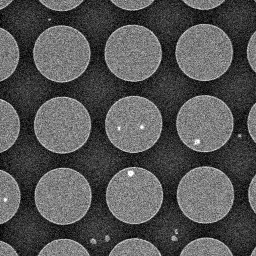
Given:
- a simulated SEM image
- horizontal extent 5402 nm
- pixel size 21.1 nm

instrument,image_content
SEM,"an array of small figures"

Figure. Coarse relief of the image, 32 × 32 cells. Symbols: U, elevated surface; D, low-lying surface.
UDDDDUUUUUDDDDUUUUUDDDDUUUUUDDDD
DDDDDDDDDDDDDDDDDDDDDDDDDDDDDDDD
DDDDDDDDDDDDDDDDDDDDDDDDDDDDDDDD
DDDDDDUUUDDDDDDUUUDDDDDDUUUDDDDD
UDDDDUUUUUDDDDUUUUUDDDDUUUUUDDDD
UUDDUUUUUUUDDUUUUUUUDDUUUUUUUDDU
UUDDUUUUUUUDDUUUUUUUDDUUUUUUUDDU
UUDDUUUUUUUDDUUUUUUUDDUUUUUUUDDU
UUDDDUUUUUUDDDUUUUUUDDDUUUUUDDDD
UDDDDDUUUUDDDDDUUUUDDDDDUUUDDDDD
DDDDDDDDDDDDDDDDDDDDDDDDDDDDDDDD
DDDDDDDDDDDDDDDDDDDDDDDDDDDDDDDD
DDDDDDUUUDDDDDDUUUUDDDDDUUUUDDDD
UUDDDUUUUUUDDDUUUUUUDDDUUUUUUDDD
UUDDDUUUUUUDDUUUUUUUDDUUUUUUUDDU
UUDDUUUUUUUDDUUUUUUUDDUUUUUUUDDU
UUDDUUUUUUUDDUUUUUUUDDUUUUUUUDDU
UUDDDUUUUUUDDDUUUUUUDDDUUUUUDDDD
UDDDDDUUUUDDDDDUUUUDDDDDUUUDDDDD
DDDDDDDDDDDDDDDDDDDDDDDDDDDDDDDD
DDDDDDDDDDDDDDDDDDDDDDDDDDDDDDDD
UDDDDDUUUUDDDDDUUUUDDDDDUUUUDDDD
UUDDDUUUUUUDDDUUUUUUDDDUUUUUUDDD
UUDDDUUUUUUDDUUUUUUUDDUUUUUUUDDU
UUDDUUUUUUUDDUUUUUUUDDUUUUUUUDDU
UUDDDUUUUUUDDUUUUUUUDDUUUUUUUDDU
UUDDDUUUUUUDDDUUUUUUDDDUUUUUDDDD
UDDDDDUUUUDDDDDUUUUDDDDDUUUDDDDD
DDDDDDDDDDDDDDDDDDDDDDDDDDDDDDDD
DDDDDDDDDDDDDDDDDDDDDDDDDDDDDDDD
UDDDDDUUUUDDDDDUUUUDDDDDUUUUDDDD
UUDDDUUUUUUDDDUUUUUUDDDUUUUUUDDD